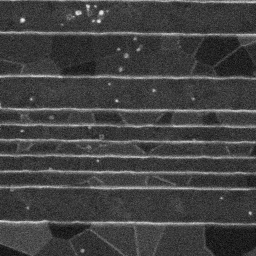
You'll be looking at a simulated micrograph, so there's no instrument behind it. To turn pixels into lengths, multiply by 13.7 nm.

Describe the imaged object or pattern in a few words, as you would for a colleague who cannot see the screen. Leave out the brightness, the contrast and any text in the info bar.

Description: wiring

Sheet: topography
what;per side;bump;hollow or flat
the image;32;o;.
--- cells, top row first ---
................................
................................
................................
................................
oooooooooooooooooooooooooooooooo
oooooooooooooooooooooooooooooooo
oooooooooooooooooooooooooooooooo
oooooooooooooooooooooooooooooooo
oooooooooooooooooooooooooooooooo
oooooooooooooooooooooooooooooooo
................................
................................
................................
................................
oooooooooooooooooooooooooooooooo
oooooooooooooooooooooooooooooooo
................................
................................
oooooooooooooooooooooooooooooooo
.......ooooooooooooooooooooooooo
................................
oooooooooo......................
oooooooooooooooooooooooooooooooo
.............oo..oo..ooooooooooo
................................
................................
................................
................................
oooooooooooooooooooooooooooooooo
oooooooooooooooooooooooooooooooo
oooooooooooooooooooooooooooooooo
oooooooooooooooooooooooooooooooo